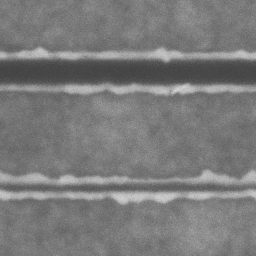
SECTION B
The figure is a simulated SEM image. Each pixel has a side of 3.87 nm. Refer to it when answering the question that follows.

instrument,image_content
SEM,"one or a few lines or trenches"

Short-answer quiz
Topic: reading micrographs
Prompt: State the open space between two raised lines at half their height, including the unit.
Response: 326 nm